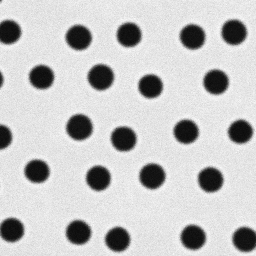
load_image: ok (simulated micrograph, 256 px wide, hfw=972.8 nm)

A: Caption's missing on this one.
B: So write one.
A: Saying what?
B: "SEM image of a regular array of holes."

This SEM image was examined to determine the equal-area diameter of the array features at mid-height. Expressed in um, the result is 0.0995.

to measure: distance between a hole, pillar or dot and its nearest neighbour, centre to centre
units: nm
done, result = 179